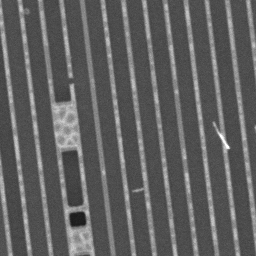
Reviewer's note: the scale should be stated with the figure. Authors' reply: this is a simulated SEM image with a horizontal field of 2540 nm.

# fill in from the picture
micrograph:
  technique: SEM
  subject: parallel lines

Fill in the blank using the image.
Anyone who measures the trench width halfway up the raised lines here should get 159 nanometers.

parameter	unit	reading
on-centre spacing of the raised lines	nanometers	204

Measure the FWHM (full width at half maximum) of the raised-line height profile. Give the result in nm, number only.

41.8